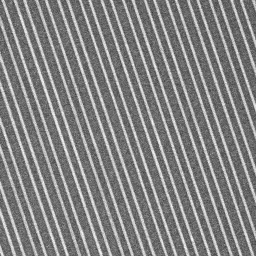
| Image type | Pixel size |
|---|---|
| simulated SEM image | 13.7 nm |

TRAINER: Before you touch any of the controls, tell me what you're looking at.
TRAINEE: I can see parallel lines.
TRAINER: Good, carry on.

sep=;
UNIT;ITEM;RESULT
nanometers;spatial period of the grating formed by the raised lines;141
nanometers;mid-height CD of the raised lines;27.7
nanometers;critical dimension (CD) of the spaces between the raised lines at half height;96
